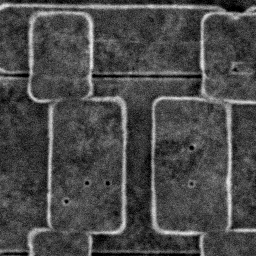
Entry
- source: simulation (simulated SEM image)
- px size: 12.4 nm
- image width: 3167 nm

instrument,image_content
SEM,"wiring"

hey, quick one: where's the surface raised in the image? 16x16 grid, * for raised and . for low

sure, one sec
................
..****.......***
..****.......***
..****.......***
..****.......***
..****.......***
...*****..*****.
...*****..****..
...*****..****..
...*****..****..
...*****..****..
...*****..****..
...*****..****..
...*****..****..
..*****...******
..****.......***